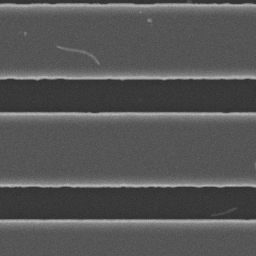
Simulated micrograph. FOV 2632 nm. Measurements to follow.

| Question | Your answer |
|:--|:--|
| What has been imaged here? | lines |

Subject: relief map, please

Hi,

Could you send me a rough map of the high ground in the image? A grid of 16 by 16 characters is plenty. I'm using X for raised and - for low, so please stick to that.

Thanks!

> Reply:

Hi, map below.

XXXXXXXXXXXXXXXX
XXXXXXXXXXXXXXXX
XXXXXXXXXXXXXXXX
XXXXXXXXXXXXXXXX
XXXXXXXXXXXXXXXX
----------------
----------------
XXXXXXXXXXXXXXXX
XXXXXXXXXXXXXXXX
XXXXXXXXXXXXXXXX
XXXXXXXXXXXXXXXX
XXXXXXXXXXXXXXXX
----------------
----------------
XXXXXXXXXXXXXXXX
XXXXXXXXXXXXXXXX